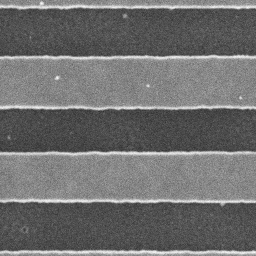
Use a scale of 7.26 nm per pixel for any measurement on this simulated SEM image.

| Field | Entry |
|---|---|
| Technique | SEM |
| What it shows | lines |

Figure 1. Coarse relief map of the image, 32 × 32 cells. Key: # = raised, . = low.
################################
................................
................................
................................
................................
................................
................................
################################
################################
################################
################################
################################
################################
#...#####.###############.#...##
................................
................................
................................
................................
................................
################################
################################
################################
################################
################################
################################
................................
................................
................................
................................
................................
................................
################################